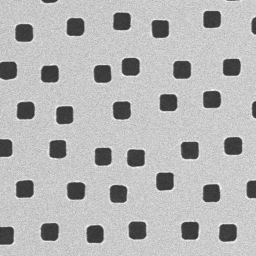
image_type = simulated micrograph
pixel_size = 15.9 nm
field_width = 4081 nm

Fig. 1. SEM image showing a regular array of holes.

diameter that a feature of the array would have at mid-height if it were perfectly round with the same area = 313 nm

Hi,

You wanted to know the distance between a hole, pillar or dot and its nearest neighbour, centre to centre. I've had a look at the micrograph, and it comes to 0.626 micrometres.